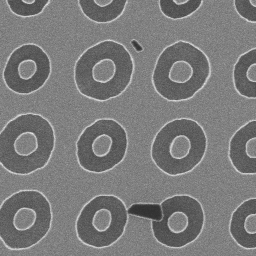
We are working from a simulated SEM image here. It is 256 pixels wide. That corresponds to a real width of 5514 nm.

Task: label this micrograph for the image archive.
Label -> ring-shaped grooves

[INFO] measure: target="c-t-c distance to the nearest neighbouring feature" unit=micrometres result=1.62